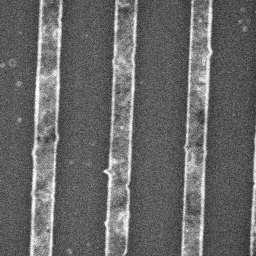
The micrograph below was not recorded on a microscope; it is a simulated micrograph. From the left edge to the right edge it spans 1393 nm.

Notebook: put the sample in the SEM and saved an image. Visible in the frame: one or a few lines or trenches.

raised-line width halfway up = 108 nm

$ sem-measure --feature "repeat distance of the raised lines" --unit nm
408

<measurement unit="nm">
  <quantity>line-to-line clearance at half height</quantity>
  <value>301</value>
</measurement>